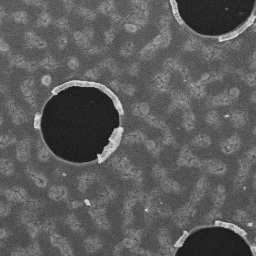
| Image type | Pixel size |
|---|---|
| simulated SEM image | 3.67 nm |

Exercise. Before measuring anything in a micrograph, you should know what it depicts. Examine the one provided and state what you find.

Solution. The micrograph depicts holes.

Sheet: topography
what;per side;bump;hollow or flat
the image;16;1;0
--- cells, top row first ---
1111111111100000
1111111111110001
1111111111111111
1111111111111111
1111111111111111
1111001111111111
1110000111111111
1110000111111111
1110000111111111
1110001111111111
1111111111111111
1111111111111111
1111111111111111
1111111111111111
1111111111110001
1111111111100000